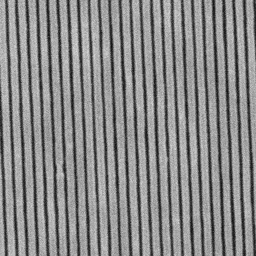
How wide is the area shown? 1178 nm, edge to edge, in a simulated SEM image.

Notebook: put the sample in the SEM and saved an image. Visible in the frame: parallel lines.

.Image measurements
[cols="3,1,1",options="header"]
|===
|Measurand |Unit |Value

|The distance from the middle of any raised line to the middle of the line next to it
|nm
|47.6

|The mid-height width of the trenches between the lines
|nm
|16.1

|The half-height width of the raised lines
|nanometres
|31.6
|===